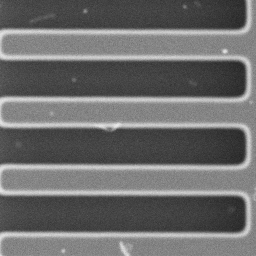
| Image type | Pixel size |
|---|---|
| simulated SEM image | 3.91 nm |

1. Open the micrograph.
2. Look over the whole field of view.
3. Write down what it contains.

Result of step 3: groups of lines, slits or small figures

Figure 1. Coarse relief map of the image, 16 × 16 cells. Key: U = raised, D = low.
DDDDDDDDDDDDDDDU
DDDDDDDDDDDDDDDU
UUUUUUUUUUUUUUUU
UUUUUUUUUUUUUUUU
DDDDDDDDDDDDDDDU
DDDDDDDDDDDDDDDU
UUUUUUUUUUUUUUUU
UUUUUUUUUUUUUUUU
DDDDDDDDDDDDDDDU
DDDDDDDDDDDDDDDU
UUUUUUUUUUUUUUUU
UUUUUUUUUUUUUUUU
DDDDDDDDDDDDDDDU
DDDDDDDDDDDDDDDU
DDDDDDDDDDDDDDDU
UUUUUUUUUUUUUUUU